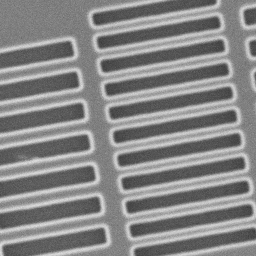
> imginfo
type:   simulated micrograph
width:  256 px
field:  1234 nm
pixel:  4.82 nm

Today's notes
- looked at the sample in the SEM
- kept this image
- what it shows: groups of lines, slits or small figures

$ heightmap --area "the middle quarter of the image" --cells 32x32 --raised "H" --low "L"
HHHHHHHHHLLLLLLLLLLLLLHHHHHHHHHH
HHHHHHHHHLLLLLLHHHHHHHHHHHHHLLLL
LLLLHHHHHHHHHHHHHHHHHHHLLLLLLLLL
LLLLHHHHHHHHHHHHHLLLLLLLLLLLLLLL
LLLLHHHHHHHHLLLLLLLLLLLLLLLLLLLL
LLLLHHHHHHLLLLLLLLLLLLLLLLLHHHHH
LLHHHHHHHHLLLLLLLLLLLLHHHHHHHHHH
HHHHHHHHHHLLLLLLHHHHHHHHHHHHHLLL
HHHHHHHHHHHHHHHHHHHHHHHLLLLLLLLL
HHHLHHHHHHHHHHHHHLLLLLLLLLLLLLLL
LLLLLHHHHHHHLLLLLLLLLLLLLLLLLLLL
LLLLLHHHHHHLLLLLLLLLLLLLLLLLHHHH
LLLLLHHHHHHLLLLLLLLLLLHHHHHHHHHH
LLLLLHHHHHHLLLLLHHHHHHHHHHHHHLLL
LLHHHHHHHHHHHHHHHHHHHHHHLLLLLLLL
HHHHHHHHHHHHHHHHHHHLLLLLLLLLLLLL
HHHHHHHHHHHHLLLLLLLLLLLLLLLLLLLL
HHHHLLHHHHHHLLLLLLLLLLLLLLLLHHHH
LLLLLLLHHHHHLLLLLLLLLLHHHHHHHHHH
LLLLLLLHHHHHLLLLLHHHHHHHHHHHHHLL
LLLLLLLHHHHHHHHHHHHHHHHHLLLLLLLL
LLLLLLLHHHHHHHHHHHLLLLLLLLLLLLLL
LLLHHHHHHHHHHHLLLLLLLLLLLLLLLLLL
HHHHHHHHHHHHHLLLLLLLLLLLLLLLLHHH
HHHHHHHHHHHHHLLLLLLLLLLHHHHHHHHH
HHHHLLLLHHHHHHLLLHHHHHHHHHHHHHLL
LLLLLLLLHHHHHHHHHHHHHHHHHLLLLLLL
LLLLLLLLHHHHHHHHHHLLLLLLLLLLLLLL
LLLLLLLLHHHHHHLLLLLLLLLLLLLLLLLL
LLLLLLLLHHHHHHLLLLLLLLLLLLLLLHHH
LLLHHHHHHHHHHHLLLLLLLLLHHHHHHHHH
HHHHHHHHHHHHHHHLLHHHHHHHHHHHHHLL